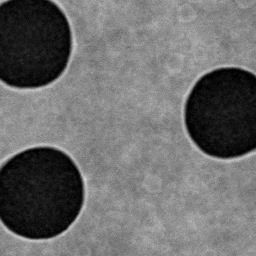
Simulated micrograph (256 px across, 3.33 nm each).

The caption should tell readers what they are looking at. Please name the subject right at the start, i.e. holes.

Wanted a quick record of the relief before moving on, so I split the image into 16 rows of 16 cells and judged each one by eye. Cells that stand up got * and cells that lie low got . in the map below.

....************
....************
....************
....************
....*********...
*.**********....
************....
************....
************....
*...*********...
.....***********
.....***********
.....***********
.....***********
*...************
****************